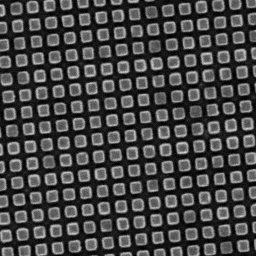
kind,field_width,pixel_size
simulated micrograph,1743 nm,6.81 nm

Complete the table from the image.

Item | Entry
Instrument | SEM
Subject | a regular array of raised bodies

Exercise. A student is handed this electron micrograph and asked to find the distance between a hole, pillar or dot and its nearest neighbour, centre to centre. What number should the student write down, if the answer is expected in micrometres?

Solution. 0.114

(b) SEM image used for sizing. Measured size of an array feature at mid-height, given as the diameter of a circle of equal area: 84.6 nm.